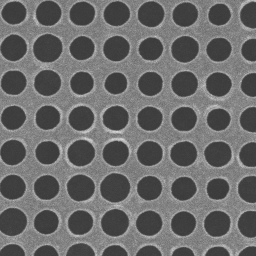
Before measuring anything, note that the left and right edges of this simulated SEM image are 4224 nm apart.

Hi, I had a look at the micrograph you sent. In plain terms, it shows a regular array of holes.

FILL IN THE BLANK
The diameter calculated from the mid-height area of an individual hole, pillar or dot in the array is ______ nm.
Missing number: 416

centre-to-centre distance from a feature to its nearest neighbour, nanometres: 563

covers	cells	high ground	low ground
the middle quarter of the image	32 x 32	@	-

@@@@@@@@@@@@@@@@@@@@@@@@@@@@@@@@
@@@@@@@@@@@@@@@@@@@@@@@@@@@@@@@@
@@@---@@@@@@---@@@@@----@@@@----
@@-----@@@@----@@@@-----@@@-----
@@-----@@@------@@@------@@-----
@@-----@@@------@@@------@@-----
@@-----@@@@----@@@@-----@@@-----
@@@--@@@@@@@-@@@@@@@---@@@@@----
@@@@@@@@@@@@@@@@@@@@@@@@@@@@@@@@
@@@@@@@@@@@@@@@@@@@@@@@@@@@@@@@@
@@@@-@@@@@@@--@@@@@@@-@@@@@@@@@@
@@-----@@@@-----@@@-----@@@@----
@------@@@------@@-------@@-----
@-------@@------@@-------@@-----
@------@@@------@@------@@@-----
@@-----@@@-----@@@@-----@@@-----
@@@--@@@@@@@--@@@@@@---@@@@@@---
@@@@@@@@@@@@@@@@@@@@@@@@@@@@@@@@
@@@@@@@@@@@@@@@@@@@@@@@@@@@@@@@@
@@@---@@@@@----@@@@@--@@@@@@@--@
@------@@@------@@@-----@@@-----
@-------@@------@@-------@@-----
@-------@@------@@-------@@-----
@------@@@------@@-------@@-----
@@-----@@@-----@@@@-----@@@-----
@@@--@@@@@@@-@@@@@@@@@@@@@@@@--@
@@@@@@@@@@@@@@@@@@@@@@@@@@@@@@@@
@@@@@@@@@@@---@@@@@@@@@@@@@@@@@@
@@-----@@@------@@@@---@@@@@----
@------@@@------@@@-----@@@-----
@-------@--------@------@@@-----
@-------@-------@@------@@@-----